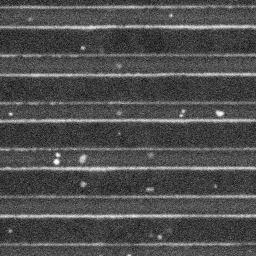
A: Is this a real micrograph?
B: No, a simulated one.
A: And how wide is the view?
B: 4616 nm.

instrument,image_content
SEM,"lines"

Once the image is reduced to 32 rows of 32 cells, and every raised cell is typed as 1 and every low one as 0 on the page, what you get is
11111111111111111111111111111111
00000000000000000000000000000000
00000000000000000000000000000000
11111111111111111111111111111111
11111111111111111111111111111111
11111111111111111111111111111111
11111111111111111111111111111111
00000000000000000000000000000000
00000000000000000000000000000000
11111111111111111111111111111111
11111111111111111111111111111111
11111111111111111111111111111111
11111111111111111111111111111111
00000000000000000000000000000000
00000000000000000000000000000000
11111111111111111111111111111111
11111111111111111111111111111111
11111111111111111111111111111111
11111111111111111111111111111111
00000000000000000000000000000000
00000000000000000000000000000000
11111111111111111111111111111111
11111111111111111111111111111111
11111111111111111111111111111111
11111111111111111111111111111111
00000000000000000000000000000000
00000000000000000000000000000000
11111111111111111111111111111111
11111111111111111111111111111111
11111111111111111111111111111111
11111111111111111111111111111000
00000000000000000000000000000000